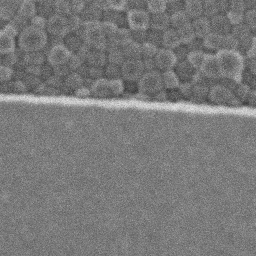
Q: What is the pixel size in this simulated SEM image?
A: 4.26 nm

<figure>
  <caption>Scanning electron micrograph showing one or a few lines or trenches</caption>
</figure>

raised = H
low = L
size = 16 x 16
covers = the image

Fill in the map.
LLLLLLLLLLLLLLLL
LLLLLLLLLLLLLLLL
LLLLLLLLLLLLLLLL
LLLLLLLLLLLLLLLL
LLLLLLLLLLLLLLLL
LLLLLLLLLLLLLLLL
HHHHHHHHHLLLLLLL
HHHHHHHHHHHHHHHH
HHHHHHHHHHHHHHHH
HHHHHHHHHHHHHHHH
HHHHHHHHHHHHHHHH
HHHHHHHHHHHHHHHH
HHHHHHHHHHHHHHHH
HHHHHHHHHHHHHHHH
HHHHHHHHHHHHHHHH
HHHHHHHHHHHHHHHH